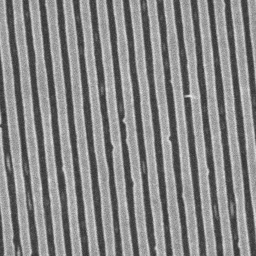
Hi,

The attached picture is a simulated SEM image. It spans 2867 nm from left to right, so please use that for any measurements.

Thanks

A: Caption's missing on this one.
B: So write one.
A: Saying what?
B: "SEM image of parallel lines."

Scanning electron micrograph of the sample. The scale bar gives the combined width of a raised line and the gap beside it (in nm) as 187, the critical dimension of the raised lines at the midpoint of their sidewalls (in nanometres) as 102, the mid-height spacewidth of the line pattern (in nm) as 91.9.